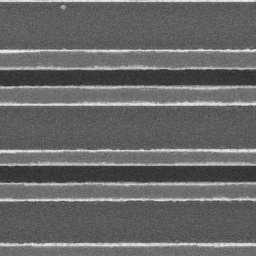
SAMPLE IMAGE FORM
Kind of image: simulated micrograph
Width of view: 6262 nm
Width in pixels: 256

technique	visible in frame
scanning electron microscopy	lines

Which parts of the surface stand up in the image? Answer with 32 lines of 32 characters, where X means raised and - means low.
--------------------------------
--------------------------------
--------------------------------
--------------------------------
--------------------------------
--------------------------------
XXXXXXXXXXXXXXXXXXXXXXXXXXXXXXXX
XXXXXXXXXXXXXXXXXXXXXXXXXXXXXXXX
XXXXXXXXXXXXXXXXXXXXXXXXXXXXXXXX
--------------------------------
--------------------------------
XXXXXXXXXXXXXXXXXXXXXXXXXXXXXXXX
XXXXXXXXXXXXXXXXXXXXXXXXXXXXXXXX
--------------------------------
--------------------------------
--------------------------------
--------------------------------
--------------------------------
--------------------------------
XXXXXXXXXXXXXXXXXXXXXXXXXXXXXXXX
XXXXXXXXXXXXXXXXXXXXXXXXXXXXXXXX
--------------------------------
--------------------------------
XXXXXXXXXXXXXXXXXXXXXXXXXXXXXXXX
XXXXXXXXXXXXXXXXXXXXXXXXXXXXXXXX
--------------------------------
--------------------------------
--------------------------------
--------------------------------
--------------------------------
--------------------------------
XXXXXXXXXXXXXXXXXXXXXXXXXXXXXXXX